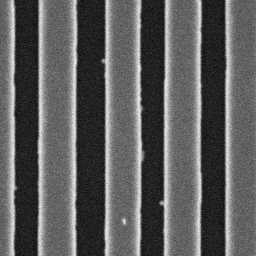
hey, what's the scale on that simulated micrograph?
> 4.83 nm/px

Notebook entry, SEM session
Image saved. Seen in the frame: lines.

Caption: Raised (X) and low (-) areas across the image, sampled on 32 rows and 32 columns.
XX---XXXX----XXXXX---XXXX---XXXX
XX---XXXX----XXXX----XXXX---XXXX
XX---XXXX----XXXX----XXXX---XXXX
XX---XXXXX---XXXX----XXXX---XXXX
XX---XXXXX---XXXX----XXXX---XXXX
XX---XXXX----XXXX----XXXX---XXXX
XX---XXXX----XXXX----XXXX---XXXX
XX---XXXX----XXXX----XXXX---XXXX
XX---XXXX----XXXX----XXXX---XXXX
XX---XXXX----XXXX----XXXX---XXXX
XX---XXXX----XXXX----XXXX---XXXX
XX---XXXX----XXXX----XXXX---XXXX
XX---XXXX----XXXX----XXXX---XXXX
XX---XXXX----XXXX----XXXX---XXXX
XX---XXXX----XXXXX---XXXX---XXXX
XX---XXXX----XXXXX---XXXX---XXXX
XX---XXXX----XXXXX---XXXX---XXXX
XX---XXXX----XXXXX---XXXX---XXXX
XX---XXXX----XXXXX---XXXX---XXXX
XX---XXXX----XXXXX---XXXX---XXXX
XX---XXXX----XXXXX---XXXX---XXXX
XX---XXXX----XXXXX---XXXX---XXXX
XX---XXXX----XXXXX---XXXX---XXXX
XX---XXXX----XXXXX---XXXX---XXXX
XX---XXXX----XXXXX---XXXX---XXXX
XX---XXXX----XXXX----XXXX---XXXX
XX---XXXX----XXXX----XXXX---XXXX
XX---XXXX----XXXX----XXXX---XXXX
XX---XXXX----XXXX----XXXX---XXXX
XX---XXXX----XXXX----XXXX---XXXX
XX---XXXX----XXXX----XXXX---XXXX
XX---XXXX----XXXX----XXXX---XXXX